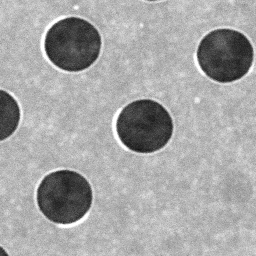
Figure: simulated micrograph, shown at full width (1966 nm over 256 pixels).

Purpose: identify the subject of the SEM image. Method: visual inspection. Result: holes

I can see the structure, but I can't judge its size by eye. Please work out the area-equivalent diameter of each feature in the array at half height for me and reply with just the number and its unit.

438 nanometers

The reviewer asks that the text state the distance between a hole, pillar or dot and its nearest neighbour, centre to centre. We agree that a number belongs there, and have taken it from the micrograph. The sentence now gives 0.823 µm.